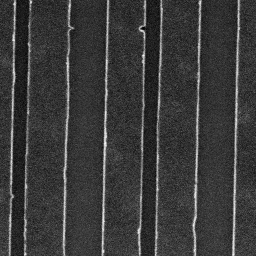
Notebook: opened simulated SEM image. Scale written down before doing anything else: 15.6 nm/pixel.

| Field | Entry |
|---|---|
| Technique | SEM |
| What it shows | one or a few lines or trenches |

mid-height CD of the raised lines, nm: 612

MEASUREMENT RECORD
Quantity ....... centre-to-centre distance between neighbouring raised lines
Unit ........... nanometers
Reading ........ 1020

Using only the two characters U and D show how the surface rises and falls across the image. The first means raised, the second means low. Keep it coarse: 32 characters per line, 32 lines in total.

UUDDUUUUUDDDDDUUUUDDUUUUUDDDDDUU
UUDDUUUUUDDDDUUUUUDDUUUUUDDDDDUU
UUDDUUUUUDDDDUUUUUDDUUUUUDDDDDUU
UUDDUUUUUDDDDUUUUUDDUUUUUDDDDDUU
UUDDUUUUUDDDDUUUUUDDUUUUUDDDDDUU
UUDDUUUUUDDDDUUUUUDDUUUUUDDDDDUU
UUDDUUUUUDDDDUUUUUDDUUUUUDDDDDUU
UUDDUUUUUDDDDUUUUUDDUUUUUDDDDDUU
UUDDUUUUDDDDDUUUUUDDUUUUUDDDDDUU
UUDDUUUUDDDDDUUUUUDDUUUUUDDDDDUU
UUDDUUUUDDDDDUUUUUDDUUUUUDDDDDUU
UUDDUUUUDDDDDUUUUUDDUUUUUDDDDDUU
UUDDUUUUDDDDDUUUUUDDUUUUUDDDDDUU
UUDUUUUUUDDDDUUUUUDDUUUUUDDDDDUU
UUDUUUUUUDDDDUUUUUDDUUUUUDDDDDUU
UUDUUUUUDDDDDUUUUUDDUUUUUDDDDUUU
UUDUUUUUDDDDDUUUUUDDUUUUUDDDDUUU
UDDUUUUUDDDDDUUUUUDDUUUUUDDDDDUU
UDDUUUUUDDDDDUUUUUDDUUUUUDDDDDUU
UDDUUUUUDDDDDUUUUUDDUUUUUDDDDUUU
UDDUUUUUDDDDDUUUUUDDUUUUUDDDDUUU
UDDUUUUUDDDDDUUUUUDDUUUUUDDDDUUU
UDDUUUUUDDDDDUUUUUDDUUUUDDDDDUUU
UDDUUUUUDDDDDUUUUUDDUUUUDDDDDUUU
UUDUUUUUDDDDDUUUUUDDUUUUDDDDDUUU
UDDUUUUUDDDDDUUUUUDDUUUUDDDDDUUU
UDDUUUUUDDDDDUUUUUDDUUUUDDDDDUUU
UDDUUUUUDDDDDUUUUUDDUUUUDDDDDUUU
UDDUUUUUDDDDDUUUUUDDUUUUDDDDDUUU
UDDUUUUUDDDDDUUUUDDDUUUUDDDDDUUU
UDDUUUUUDDDDDUUUUDDDUUUUDDDDDUUU
UDDUUUUUDDDDDUUUUDDUUUUUDDDDDUUU